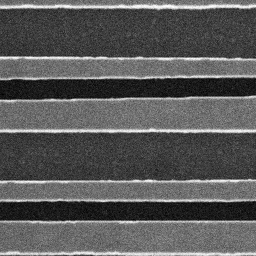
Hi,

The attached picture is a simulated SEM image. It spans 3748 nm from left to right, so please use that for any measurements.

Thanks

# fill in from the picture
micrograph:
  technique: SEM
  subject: lines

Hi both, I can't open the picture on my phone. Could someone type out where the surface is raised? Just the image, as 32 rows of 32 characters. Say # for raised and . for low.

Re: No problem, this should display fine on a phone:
################################
................................
................................
................................
................................
................................
................................
################################
################################
################################
................................
................................
......#..#######################
################################
################################
################################
................................
................................
................................
................................
................................
................................
................................
################################
################################
................................
................................
................................
################################
################################
################################
################################